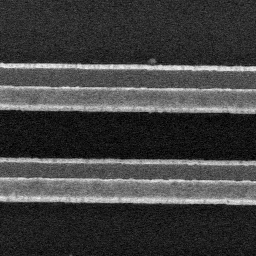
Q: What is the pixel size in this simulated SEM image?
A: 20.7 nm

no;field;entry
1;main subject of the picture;lines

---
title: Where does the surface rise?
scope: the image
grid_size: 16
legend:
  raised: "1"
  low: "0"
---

0000000000000000
0000000000000000
0000000000000000
0000000000000000
1111111111111111
1111111111111111
1111111111111111
0000000000000000
0000000000000000
0000000000000000
1111111111111111
1111111111111111
0000000011111111
0000000000000000
0000000000000000
0000000000000000